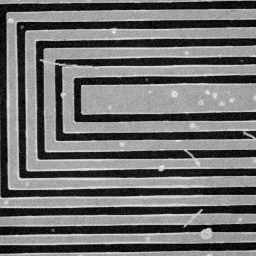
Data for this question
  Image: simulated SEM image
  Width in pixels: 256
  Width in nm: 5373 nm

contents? groups of lines, slits or small figures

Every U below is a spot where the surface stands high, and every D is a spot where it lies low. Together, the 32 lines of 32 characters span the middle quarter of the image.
DDDUDDDDDDDDDDDDDDDDDDDDDDDDDDDD
UUUUUUUUUUUUUUUUUUUUUUUUUUUUUUUU
UUUUUUUUUUUUUUUUUUUUUUUUUUUUUUUU
UUUDDDDDDDDDDDDDDDDDDDDDDDDDDDDD
UUDDDDDDDDDDDDDDDDDDDDDDDDDDDDDD
UUDDDUUUUUUUUUUUUUUUUUUUUUUUUUUU
UUDDUUUUUUUUUUUUUUUUUUUUUUUUUUUU
UUDDUUUUUUUUUUUUUUUUUUUUUUUUUUUU
UUDDUUUUUUUUUUUUUUUUUUUUUUUUUUUU
UUDDUUUUUUUUUUUUUUUUUUUUUUUUUUUU
UUDDDUUUUUUUUUUUUUUUUUUUUUUUUUUU
UUDDDUUUUUUUUUUUUUUUUUUUUUUUUUUU
UUDDDUUDDDDDDDDDDDDDDDDDDDDDDDDD
UUDDDDDDDDDDDDDDDDDDDDDDDDDDDDDD
UUUDDDDDDDDDDDDDDDDUUUUUUUUUUUUU
UUUUUUUUUUUUUUUUUUUUUUUUUUUUUUUU
UUUUUUUUUUUUUUUUUUUUUUUUUUUUUUUU
DDDDDDDDDDDDDDDDDDDDDDDDDDDDDDDD
DDDDDDDDDDDDDDDDDDDDDDDDDDDDDDDD
UUUUUUUUUUUUUUUUUUUUUUUUUUUUUUUU
UUUUUUUUUUUUUUUUUUUUUUUUUUUUUUUU
UUUUUUUUUUUUUUUUUUUUDDDDDDDDDDUD
DDDDDDDDDDDDDDDDDDDDDDDDDDDDDDDD
DDDDDDDDDDDDDDDDDDDDDDDDDDDDDDDD
UUUUUUUUUUUUUUUUUUUUUUUUUUUUUUUU
UUUUUUUUUUUUUUUUUUUUUUUUUUUUUUUU
DDDDDDDDDDDDDDDDDDDDDDDDUDDDDDDD
DDDDDDDDDDDDDDDDDDDDDDDDDDDDDDDD
DDDDDDDDDDDDDDDDDDDDDDDDDDDDDUUU
UUUUUUUUUUUUUUUUUUUUUUUUUUUUUUUU
UUUUUUUUUUUUUUUUUUUUUUUUUUUDDDDD
DDDDDDDDDDDDDDDDDDDDDDDDDDDDDDDD